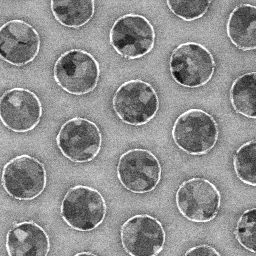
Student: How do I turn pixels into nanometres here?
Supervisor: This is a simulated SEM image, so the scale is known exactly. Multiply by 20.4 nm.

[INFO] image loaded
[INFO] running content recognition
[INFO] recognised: a regular array of raised bodies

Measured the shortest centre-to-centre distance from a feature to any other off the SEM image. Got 1350 nanometers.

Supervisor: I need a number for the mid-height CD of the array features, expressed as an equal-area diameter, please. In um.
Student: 0.896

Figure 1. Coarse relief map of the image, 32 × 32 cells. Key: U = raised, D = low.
DDDDDDDUUUUUDDDDDDDDDUUUUUDDDDDD
DDDDDDDUUUUUDDDDDDDDDDUUUUDDDUUU
DDDDDDDUUUUDDDDUUUDDDDDDDDDDDUUU
UUUUDDDDDDDDDDUUUUUDDDDDDDDDDUUU
UUUUUDDDDDDDDDUUUUUDDDDDDDDDDUUU
UUUUUDDDDDDDDDUUUUUDDDDUDDDDDUUU
UUUUUDDDDUUDDDDUUUDDDDUUUUDDDDDD
DUUUDDDUUUUUDDDDDDDDDUUUUUUDDDDD
DDDDDDDUUUUUDDDDDDDDDUUUUUUDDDDD
DDDDDDDUUUUUDDDDDDDDDDUUUUDDDDUU
DDDDDDDUUUUUDDDDUUDDDDDUUDDDDUUU
DUUUDDDDDUUDDDDUUUUDDDDDDDDDDUUU
UUUUUDDDDDDDDDUUUUUUDDDDDDDDDUUU
UUUUUDDDDDDDDDUUUUUUDDDDDDDDDUUU
UUUUUDDDDDDDDDDUUUUDDDDUUUDDDDDU
DUUUDDDDUUUUDDDDUDDDDDUUUUUDDDDD
DDDDDDDUUUUUDDDDDDDDDDUUUUUDDDDD
DDDDDDDUUUUUUDDDDDDDDDUUUUUDDDDD
DDDDDDDUUUUUDDDDDDDDDDDUUUDDDDUU
DDDDDDDDUUUUDDDUUUUDDDDDDDDDDUUU
DUUUUDDDDDDDDDDUUUUUDDDDDDDDDUUU
UUUUUUDDDDDDDDDUUUUUDDDDDDDDDDUU
UUUUUUDDDDDDDDDUUUUUDDDDUUDDDDUU
DUUUUDDDDUUDDDDDUUUDDDUUUUUDDDDD
DUUUUDDDUUUUUDDDDDDDDDUUUUUDDDDD
DDDDDDDDUUUUUDDDDDDDDDUUUUUDDDDD
DDDDDDDDUUUUUDDDDDDDDDDUUUUDDDDU
DDDDDDDDUUUUUDDDUUUUDDDDUUDDDDUU
DUUUUDDDDUUUDDDUUUUUDDDDDDDDDDUU
DUUUUUDDDDDDDDDUUUUUUDDDDDDDDUUU
DUUUUUDDDDDDDDDUUUUUDDDDDDDDDDUU
DUUUUUDDDDDDDDDDUUUUDDDDUUUDDDDD